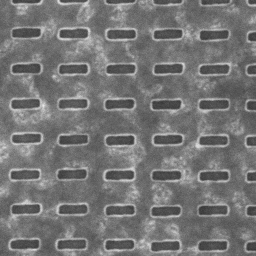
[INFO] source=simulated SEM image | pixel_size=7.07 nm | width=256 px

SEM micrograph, a regular array of holes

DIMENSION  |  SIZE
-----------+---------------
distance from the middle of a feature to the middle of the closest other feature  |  246 nm